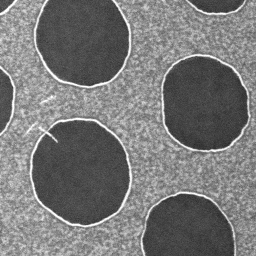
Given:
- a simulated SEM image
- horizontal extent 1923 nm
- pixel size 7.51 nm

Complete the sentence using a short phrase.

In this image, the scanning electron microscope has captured holes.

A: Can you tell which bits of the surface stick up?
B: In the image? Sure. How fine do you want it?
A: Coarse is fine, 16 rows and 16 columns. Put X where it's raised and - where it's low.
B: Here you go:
-XX----XXXXX---X
XX------XXXXXXXX
XX------XXXXXXXX
XXX-----XXXX-XXX
XXX----XXXX----X
-XXXXXXXXX-----X
-XXXXXXXXX------
-XXX--XXXX------
XXX----XXXX----X
XX------XXXXXXXX
XX------XXXXXXXX
XX------XXXXXXXX
XX------XX---XXX
XXXX---XX-----XX
XXXXXXXXX------X
XXXXXXXXX------X